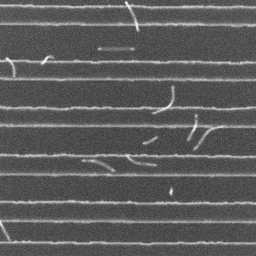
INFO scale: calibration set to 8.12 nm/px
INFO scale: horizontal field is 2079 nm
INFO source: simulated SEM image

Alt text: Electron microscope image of lines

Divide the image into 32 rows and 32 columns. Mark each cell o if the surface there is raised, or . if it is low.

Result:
................................
oooooooooooooooooooooooooooooooo
oooooooooooooooooooooooooooooooo
................................
................................
................................
................................
oo..............................
oooooooooooooooooooooooooooooooo
oooooooooooooooooooooooooooooooo
................................
................................
................................
oooooo...ooooo...oo.oooooo....oo
oooooooooooooooooooooooooooooooo
oooooooooooooooooooooooooooooooo
................................
................................
................................
ooooooooooooooooooooooooooooo...
oooooooooooooooooooooooooooooooo
oooooooooooooooooooooooooooooooo
................................
................................
................................
oooooooooooooooooooooooooooooooo
oooooooooooooooooooooooooooooooo
oooooooooooooooooooooooooooooooo
................................
................................
oooooooooooooooooooooooooooooooo
oooooooooooooooooooooooooooooooo